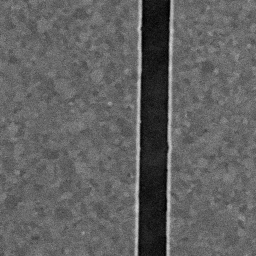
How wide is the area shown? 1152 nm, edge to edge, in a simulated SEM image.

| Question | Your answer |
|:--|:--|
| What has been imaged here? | one or a few lines or trenches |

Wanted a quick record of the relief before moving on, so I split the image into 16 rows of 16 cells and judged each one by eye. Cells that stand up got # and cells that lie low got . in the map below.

#########..#####
#########..#####
#########..#####
#########..#####
#########..#####
#########..#####
#########..#####
#########..#####
#########..#####
#########..#####
#########..#####
#########..#####
#########..#####
#########..#####
#########..#####
#########..#####